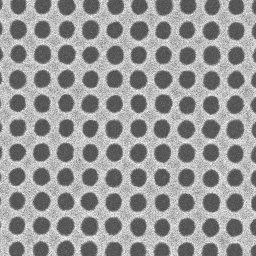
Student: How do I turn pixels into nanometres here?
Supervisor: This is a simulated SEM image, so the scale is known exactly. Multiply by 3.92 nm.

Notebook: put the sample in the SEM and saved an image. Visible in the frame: a regular array of holes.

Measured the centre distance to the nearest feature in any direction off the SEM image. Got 23.9 pixels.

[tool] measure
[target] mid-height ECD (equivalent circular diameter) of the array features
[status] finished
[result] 66.2 nanometers